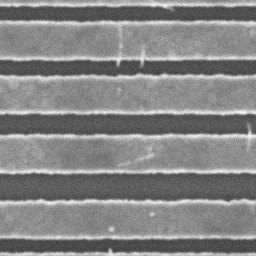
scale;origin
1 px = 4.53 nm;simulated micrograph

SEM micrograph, lines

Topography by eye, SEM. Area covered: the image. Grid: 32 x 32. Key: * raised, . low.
********************************
................................
................................
********************************
********************************
********************************
********************************
..*...........*..*..............
................................
..........**.....**.**.*****...*
********************************
********************************
********************************
********************************
................................
................................
................................
********************************
********************************
********************************
********************************
***********************.********
................................
................................
................................
********************************
********************************
********************************
********************************
********************************
................................
................................